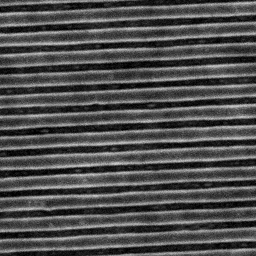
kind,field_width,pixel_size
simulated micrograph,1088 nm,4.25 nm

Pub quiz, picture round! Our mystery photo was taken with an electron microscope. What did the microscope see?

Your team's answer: parallel lines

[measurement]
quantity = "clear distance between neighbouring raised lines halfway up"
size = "33.4 nm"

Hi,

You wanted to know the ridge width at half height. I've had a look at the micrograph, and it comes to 52.5 nm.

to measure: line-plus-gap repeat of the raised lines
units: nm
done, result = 87.3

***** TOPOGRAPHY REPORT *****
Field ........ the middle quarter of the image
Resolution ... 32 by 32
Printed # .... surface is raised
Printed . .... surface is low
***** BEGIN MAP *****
................................
..............##################
################################
################################
###############.................
................................
................################
################################
################################
#####################...........
................................
.........................#######
################################
################################
#################...............
................................
.....................##.########
.....###########################
################################
###################.............
................................
........................########
......##########################
################################
#########################.......
###.............................
.............................###
........########################
################################
##########################......
#########.......................
................................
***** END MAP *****